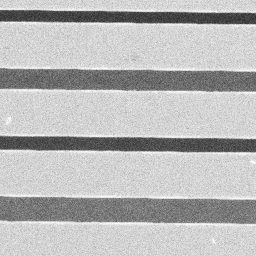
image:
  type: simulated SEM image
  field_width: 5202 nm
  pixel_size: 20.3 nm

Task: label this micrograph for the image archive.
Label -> lines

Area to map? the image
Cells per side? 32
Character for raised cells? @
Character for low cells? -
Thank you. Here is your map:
@@@@@@@@@@@@@@@@@@@@@@@@@@@@@@@@
-------------------------------@
--------------------------------
@@@@@@@@@@@@@@@@@@@@@@@@@@@@@@@@
@@@@@@@@@@@@@@@@@@@@@@@@@@@@@@@@
@@@@@@@@@@@@@@@@@@@@@@@@@@@@@@@@
@@@@@@@@@@@@@@@@@@@@@@@@@@@@@@@@
@@@@@@@@@@@@@@@@@@@@@@@@@@@@@@@@
@@@@@@@@@@@@@@@@@@@@@@@@@@@@@@@@
--------------------------------
--------------------------------
@@@@@@@@@@@@@@@@@@@@@@@@@@------
@@@@@@@@@@@@@@@@@@@@@@@@@@@@@@@@
@@@@@@@@@@@@@@@@@@@@@@@@@@@@@@@@
@@@@@@@@@@@@@@@@@@@@@@@@@@@@@@@@
@@@@@@@@@@@@@@@@@@@@@@@@@@@@@@@@
@@@@@@@@@@@@@@@@@@@@@@@@@@@@@@@@
--------------------------------
--------------------------------
@@@@@@@@@@@@@@@@@@@@@@@@@@@@@@@@
@@@@@@@@@@@@@@@@@@@@@@@@@@@@@@@@
@@@@@@@@@@@@@@@@@@@@@@@@@@@@@@@@
@@@@@@@@@@@@@@@@@@@@@@@@@@@@@@@@
@@@@@@@@@@@@@@@@@@@@@@@@@@@@@@@@
-@@@@@@@@@@@@@@@@@@@@@@@@@@@@@@@
--------------------------------
--------------------------------
--------------------------------
@@@@@@@@@@@@@@@@@@@@@@@@@@@@@@@@
@@@@@@@@@@@@@@@@@@@@@@@@@@@@@@@@
@@@@@@@@@@@@@@@@@@@@@@@@@@@@@@@@
@@@@@@@@@@@@@@@@@@@@@@@@@@@@@@@@